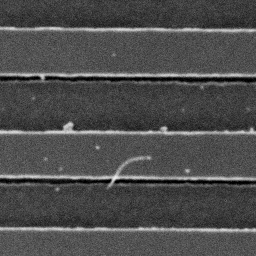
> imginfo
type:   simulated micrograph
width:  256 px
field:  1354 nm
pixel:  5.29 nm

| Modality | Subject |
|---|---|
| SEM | lines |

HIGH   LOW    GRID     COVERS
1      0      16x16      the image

0000000000000000
0000000000000000
1111111111111111
1111111111111111
1111111111111111
0000000000000000
0000000000000000
0000000000000000
1111111111111111
1111111111111111
1111111111111111
0000000000000000
0000000000000000
0000000000000000
1111111111111111
1111111111111111